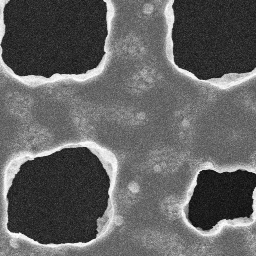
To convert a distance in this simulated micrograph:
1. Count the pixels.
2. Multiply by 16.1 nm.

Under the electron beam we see holes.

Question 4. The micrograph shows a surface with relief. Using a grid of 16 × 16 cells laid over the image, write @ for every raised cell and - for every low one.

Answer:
-------@@@@-----
-------@@@@-----
-------@@@@-----
-------@@@@-----
@-----@@@@@@----
@@@@@@@@@@@@@@@@
@@@@@@@@@@@@@@@@
@@@@@@@@@@@@@@@@
@@@@@@@@@@@@@@@@
@@@---@@@@@@@@@@
@------@@@@@@@@@
@------@@@@@----
-------@@@@@----
-------@@@@@----
@-----@@@@@@@@@@
@@@@@@@@@@@@@@@@